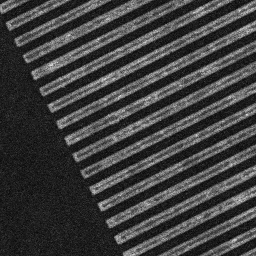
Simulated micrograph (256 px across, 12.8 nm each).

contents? parallel lines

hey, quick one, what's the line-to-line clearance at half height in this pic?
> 150 nanometres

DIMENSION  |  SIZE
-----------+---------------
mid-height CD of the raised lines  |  6.91 px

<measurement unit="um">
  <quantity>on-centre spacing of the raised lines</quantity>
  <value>0.235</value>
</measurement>